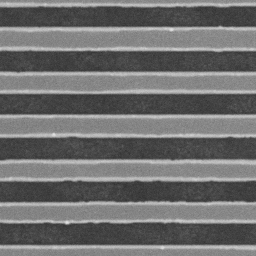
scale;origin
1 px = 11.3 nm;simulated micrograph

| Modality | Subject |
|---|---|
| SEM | lines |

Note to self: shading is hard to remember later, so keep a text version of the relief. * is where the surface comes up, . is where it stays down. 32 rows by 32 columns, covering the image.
********************************
................................
................................
.................****..*******..
********************************
********************************
................................
................................
................................
********************************
********************************
********************************
................................
................................
...*..*....*....*.............*.
********************************
********************************
................................
................................
................................
********************************
********************************
................................
................................
................................
********************************
********************************
********************************
................................
................................
................................
********************************